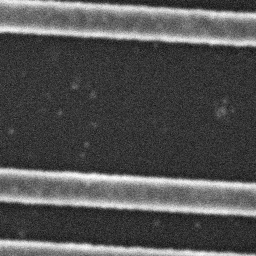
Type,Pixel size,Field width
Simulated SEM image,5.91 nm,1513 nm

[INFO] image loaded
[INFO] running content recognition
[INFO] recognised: lines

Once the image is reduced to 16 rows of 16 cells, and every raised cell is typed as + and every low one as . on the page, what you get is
++++++++++......
++++++++++++++++
..........++++++
................
................
................
................
................
................
................
................
++++++++++++++++
++++++++++++++++
................
................
+++++++++.......